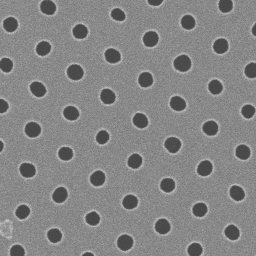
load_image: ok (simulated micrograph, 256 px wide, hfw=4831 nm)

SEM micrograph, a regular array of holes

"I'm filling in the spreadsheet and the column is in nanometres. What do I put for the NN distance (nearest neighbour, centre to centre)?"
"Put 760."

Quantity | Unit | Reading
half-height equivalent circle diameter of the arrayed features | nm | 295